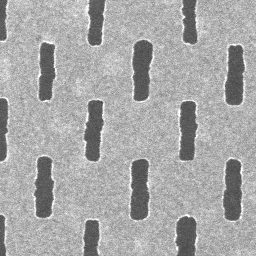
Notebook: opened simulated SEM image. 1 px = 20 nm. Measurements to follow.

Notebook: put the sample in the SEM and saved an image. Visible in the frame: a regular array of holes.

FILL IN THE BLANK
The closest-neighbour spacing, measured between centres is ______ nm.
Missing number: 1500